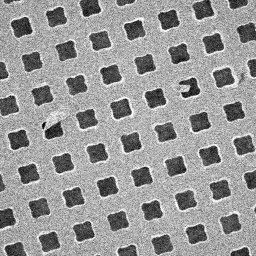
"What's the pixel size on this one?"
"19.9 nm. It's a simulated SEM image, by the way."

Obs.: a regular array of holes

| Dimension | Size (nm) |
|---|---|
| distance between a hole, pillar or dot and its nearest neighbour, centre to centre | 705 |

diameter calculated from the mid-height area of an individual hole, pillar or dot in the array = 20.8 pixels